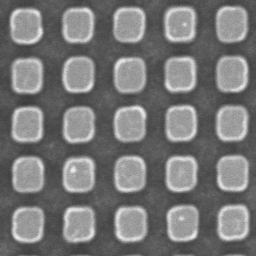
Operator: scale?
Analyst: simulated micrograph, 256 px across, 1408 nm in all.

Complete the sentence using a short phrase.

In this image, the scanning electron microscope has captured a regular array of raised bodies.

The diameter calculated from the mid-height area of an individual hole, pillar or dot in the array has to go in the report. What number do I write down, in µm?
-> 0.195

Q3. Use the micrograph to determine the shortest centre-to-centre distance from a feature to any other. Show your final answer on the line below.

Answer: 272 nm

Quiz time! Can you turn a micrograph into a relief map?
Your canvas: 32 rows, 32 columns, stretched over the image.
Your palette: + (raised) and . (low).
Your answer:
................................
..+++...+++....+++...+++...++++.
.++++...++++..++++...+++...++++.
.++++...++++..++++...+++...++++.
.++++...+++...++++...+++...++++.
...+............................
................................
..+++....++....+++...+++....++..
..+++...++++..++++...+++...++++.
.++++...++++..++++...+++...++++.
..+++...++++..++++...+++...++++.
..+++....+.....++...............
................................
..+++.....+....+++...+++....++..
..+++...++++..++++...+++...++++.
..+++...++++..++++...+++...++++.
..+++...++++..++++...+++...++++.
..+++...+++....++....+++....++..
................................
................................
..+++...++++..++++...++++..++++.
..+++...++++..++++...++++..++++.
..+++...++++..++++...++++..++++.
..+++...+++....+++...+++....+++.
................................
................................
..+++...++++...+++...++++..++++.
..+++...++++...+++...++++..++++.
..+++...++++...+++...++++..++++.
..+++...++++...+++...+++...++++.
................................
................................